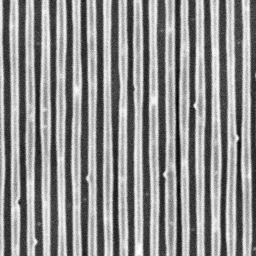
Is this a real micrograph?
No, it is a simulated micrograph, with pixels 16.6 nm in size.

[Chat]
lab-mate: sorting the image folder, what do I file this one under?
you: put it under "parallel lines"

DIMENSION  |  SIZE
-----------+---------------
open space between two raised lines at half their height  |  139 nm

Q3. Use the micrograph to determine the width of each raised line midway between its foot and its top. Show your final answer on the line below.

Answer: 124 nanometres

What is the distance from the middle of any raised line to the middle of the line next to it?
256 nm